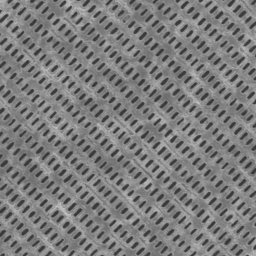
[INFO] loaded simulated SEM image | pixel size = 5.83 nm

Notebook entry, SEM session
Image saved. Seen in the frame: a regular array of holes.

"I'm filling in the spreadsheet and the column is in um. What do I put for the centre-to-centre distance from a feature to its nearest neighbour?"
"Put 0.0449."